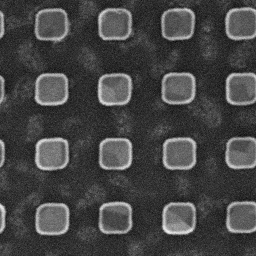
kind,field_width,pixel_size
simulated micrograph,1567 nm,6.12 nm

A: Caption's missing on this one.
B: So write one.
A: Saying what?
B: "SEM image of a regular array of raised bodies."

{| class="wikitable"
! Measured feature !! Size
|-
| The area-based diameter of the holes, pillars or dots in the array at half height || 0.2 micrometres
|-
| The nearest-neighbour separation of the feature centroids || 63.3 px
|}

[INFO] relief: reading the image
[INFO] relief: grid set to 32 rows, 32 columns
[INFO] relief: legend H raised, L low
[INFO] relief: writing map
LLLLLLLLLLLLLLLLLLLLLLLLLLLLLLLL
LLLLLHHHLLLLLHHHLLLLLHHHLLLLLHHH
LLLLLHHHLLLLLHHHLLLLHHHHLLLLHHHH
LLLLLHHHLLLLLHHHLLLLHHHHLLLLHHHH
LLLLLHHHLLLLLHHHLLLLLHHHLLLLLHHH
LLLLLLLLLLLLLLLLLLLLLLLLLLLLLLLL
LLLLLLLLLLLLLLLLLLLLLLLLLLLLLLLL
LLLLLLLLLLLLLLLLLLLLLLLLLLLLLLLL
LLLLLLLLLLLLLLLLLLLLLLLLLLLLLLLL
LLLLLHHHLLLLLHHHLLLLLHHHLLLLLHHH
LLLLLHHHLLLLHHHHLLLLHHHHLLLLHHHH
LLLLLHHHLLLLHHHHLLLLHHHHLLLLHHHH
LLLLLHHHLLLLLHHHLLLLLHHHLLLLLHHH
LLLLLLLLLLLLLLLLLLLLLLLLLLLLLLLL
LLLLLLLLLLLLLLLLLLLLLLLLLLLLLLLL
LLLLLLLLLLLLLLLLLLLLLLLLLLLLLLLL
LLLLLLLLLLLLLLLLLLLLLLLLLLLLLLLL
LLLLLLHHLLLLLHHHLLLLLHHHLLLLLHHH
LLLLLHHHLLLLLHHHLLLLLHHHLLLLHHHH
LLLLLHHHLLLLLHHHLLLLLHHHLLLLHHHH
LLLLLHHHLLLLLHHHLLLLLHHHLLLLLHHH
LLLLLLLLLLLLLLLLLLLLLLLLLLLLLLLL
LLLLLLLLLLLLLLLLLLLLLLLLLLLLLLLL
LLLLLLLLLLLLLLLLLLLLLLLLLLLLLLLL
LLLLLLLLLLLLLLLLLLLLLLLLLLLLLLLL
LLLLLLLLLLLLLHHHLLLLLLLLLLLLLHHH
HLLLLHHHLLLLLHHHLLLLLHHHLLLLLHHH
LLLLLHHHLLLLLHHHLLLLLHHHLLLLHHHH
LLLLLHHHLLLLLHHHLLLLLHHHLLLLLHHH
LLLLLLLLLLLLLLLLLLLLLLLLLLLLLLLL
LLLLLLLLLLLLLLLLLLLLLLLLLLLLLLLL
LLLLLLLLLLLLLLLLLLLLLLLLLLLLLLLL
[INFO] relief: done